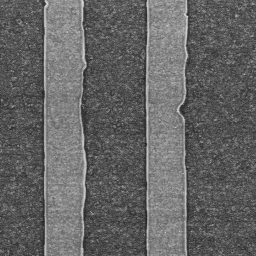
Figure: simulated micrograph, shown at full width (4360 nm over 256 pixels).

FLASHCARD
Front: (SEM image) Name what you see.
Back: one or a few lines or trenches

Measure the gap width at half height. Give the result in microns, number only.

1.1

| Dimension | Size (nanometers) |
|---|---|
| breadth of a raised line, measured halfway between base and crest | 643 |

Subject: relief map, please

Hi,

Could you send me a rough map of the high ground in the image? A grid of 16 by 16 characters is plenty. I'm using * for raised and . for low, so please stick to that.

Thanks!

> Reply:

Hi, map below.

...**....***....
...**....***....
...**....***....
...**....***....
...**....***....
...**....***....
...**....**.....
...**....**.....
...**....**.....
...**....***....
...**....***....
...**....***....
...**....***....
...**....***....
...**....***....
...**....***....